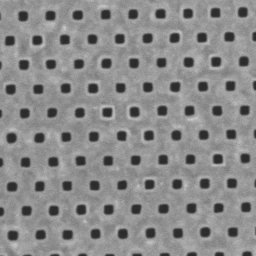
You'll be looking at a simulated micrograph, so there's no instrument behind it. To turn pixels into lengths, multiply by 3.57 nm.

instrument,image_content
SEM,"a regular array of holes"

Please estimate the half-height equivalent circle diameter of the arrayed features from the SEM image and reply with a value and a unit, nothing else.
38 nanometres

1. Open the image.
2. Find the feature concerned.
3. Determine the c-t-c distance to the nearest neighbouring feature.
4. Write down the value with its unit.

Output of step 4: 27.2 pixels